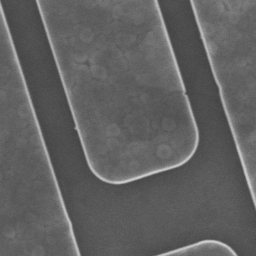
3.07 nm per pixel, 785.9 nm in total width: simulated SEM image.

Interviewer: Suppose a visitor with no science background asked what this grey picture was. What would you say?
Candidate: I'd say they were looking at one or a few lines or trenches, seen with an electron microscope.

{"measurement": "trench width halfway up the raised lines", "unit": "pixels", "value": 36.1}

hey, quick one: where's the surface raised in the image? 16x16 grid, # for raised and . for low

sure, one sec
..########..####
...#######..####
#..########..###
#..########..###
#...#######..###
##..#######...##
##..########..##
##...#######..##
###..#######...#
###..#######...#
###...#####....#
####............
####............
####............
#####...........
#####.......##..